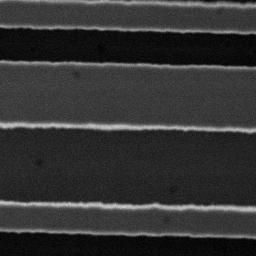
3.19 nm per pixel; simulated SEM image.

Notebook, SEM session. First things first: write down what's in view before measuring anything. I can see lines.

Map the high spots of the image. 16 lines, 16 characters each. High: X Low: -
XXXXXXXXXXXXXXXX
XXXXXXXXXXXXXXXX
----------------
----------------
XXXXXXXXXXXXXXXX
XXXXXXXXXXXXXXXX
XXXXXXXXXXXXXXXX
XXXXXXXXXXXXXXXX
----------------
----------------
----------------
----------------
----------------
XXXXXXXXXXXXXXXX
---XXXXXXXXXXXXX
----------------